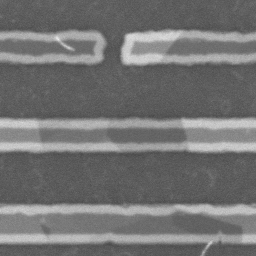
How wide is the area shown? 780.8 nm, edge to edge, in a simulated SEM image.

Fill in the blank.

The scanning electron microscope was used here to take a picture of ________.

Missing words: one or a few lines or trenches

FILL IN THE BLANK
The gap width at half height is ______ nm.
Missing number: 197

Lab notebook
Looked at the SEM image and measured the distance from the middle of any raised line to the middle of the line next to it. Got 0.269 microns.